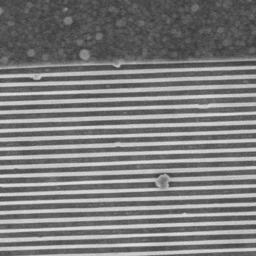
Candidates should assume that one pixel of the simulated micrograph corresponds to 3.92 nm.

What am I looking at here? parallel lines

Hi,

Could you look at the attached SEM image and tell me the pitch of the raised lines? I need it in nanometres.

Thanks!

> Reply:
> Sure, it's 35.6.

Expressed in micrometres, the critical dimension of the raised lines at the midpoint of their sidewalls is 0.0132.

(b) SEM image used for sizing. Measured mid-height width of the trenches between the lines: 0.0235 µm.